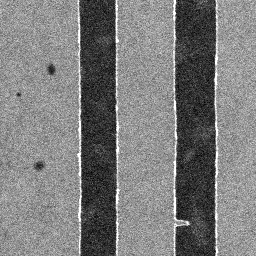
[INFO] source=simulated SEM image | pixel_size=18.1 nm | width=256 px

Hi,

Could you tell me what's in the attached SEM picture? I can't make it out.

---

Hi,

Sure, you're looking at one or a few lines or trenches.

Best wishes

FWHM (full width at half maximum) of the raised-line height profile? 702 nm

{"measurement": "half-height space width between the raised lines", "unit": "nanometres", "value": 1040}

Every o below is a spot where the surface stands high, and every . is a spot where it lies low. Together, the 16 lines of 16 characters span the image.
.....oo....ooo..
.....oo....ooo..
.....oo....ooo..
.....oo....ooo..
.....oo....ooo..
.....oo....ooo..
.....oo....oo...
.....oo....ooo..
.....oo....ooo..
.....oo....ooo..
.....oo....ooo..
.....oo....ooo..
.....oo....oo...
.....oo....ooo..
.....oo....ooo..
.....oo....ooo..